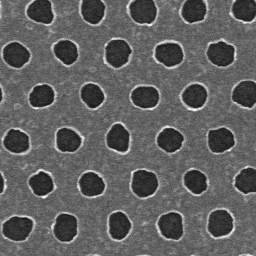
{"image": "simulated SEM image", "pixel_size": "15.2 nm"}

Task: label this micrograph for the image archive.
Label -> a regular array of holes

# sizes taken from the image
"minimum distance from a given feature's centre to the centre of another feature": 746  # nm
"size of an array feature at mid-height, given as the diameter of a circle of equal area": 393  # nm